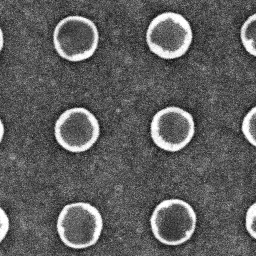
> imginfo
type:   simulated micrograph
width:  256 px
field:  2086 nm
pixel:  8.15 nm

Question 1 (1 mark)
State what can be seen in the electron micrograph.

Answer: raised bodies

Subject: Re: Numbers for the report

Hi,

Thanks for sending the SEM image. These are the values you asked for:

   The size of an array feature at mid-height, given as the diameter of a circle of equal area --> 42.4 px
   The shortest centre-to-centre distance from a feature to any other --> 758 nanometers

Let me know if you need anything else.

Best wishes